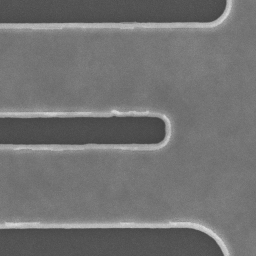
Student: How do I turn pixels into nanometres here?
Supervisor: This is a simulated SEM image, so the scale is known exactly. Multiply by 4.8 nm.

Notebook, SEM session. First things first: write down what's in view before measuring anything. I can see one or a few lines or trenches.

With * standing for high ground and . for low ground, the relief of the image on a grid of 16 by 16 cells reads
..............**
.............***
****************
****************
****************
****************
****************
..........******
..........******
****************
****************
****************
****************
****************
.............***
..............**